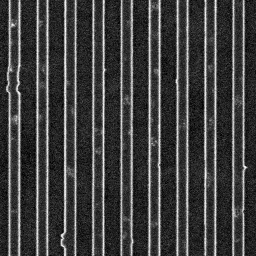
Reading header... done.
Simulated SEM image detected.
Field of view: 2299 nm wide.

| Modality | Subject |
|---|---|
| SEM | parallel lines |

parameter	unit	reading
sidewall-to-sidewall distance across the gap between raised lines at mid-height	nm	154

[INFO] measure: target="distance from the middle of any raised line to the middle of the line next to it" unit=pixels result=28.1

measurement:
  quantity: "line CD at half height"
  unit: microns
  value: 0.0921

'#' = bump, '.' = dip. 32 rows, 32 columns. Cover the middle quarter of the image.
###....###....###....###....###.
###....###....###....###....###.
###....###....###....###....###.
###....###....###....###....###.
###....###....###....###....###.
###....###....###....###....###.
###....###....###....###....###.
###....###....###....###....###.
###....###....###....###....###.
###....###....###....###....###.
###....###....###....###....###.
###....###....###....###....###.
###....###....###....###....###.
###....###....###....###....###.
###....###....###....###....###.
###....###....###....###....###.
###....###....###....###....###.
###....###....###....###....###.
###....###....###....###....###.
###....###....###....###....###.
###....###....###....###....###.
###....###....###....###....###.
###....###....###....###....###.
###....###....###....###....###.
###....###....###....###....###.
###....###....###....###....###.
###....###....###....###....###.
###....###....###....###....###.
###....###....###....###....###.
###....###....###....###....###.
###....###....###....###....###.
###....###....###....###....###.